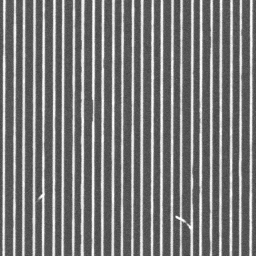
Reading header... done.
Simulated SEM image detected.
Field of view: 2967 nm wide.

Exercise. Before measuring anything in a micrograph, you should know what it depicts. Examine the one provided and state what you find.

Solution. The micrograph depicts parallel lines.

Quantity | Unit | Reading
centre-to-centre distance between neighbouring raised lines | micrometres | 0.115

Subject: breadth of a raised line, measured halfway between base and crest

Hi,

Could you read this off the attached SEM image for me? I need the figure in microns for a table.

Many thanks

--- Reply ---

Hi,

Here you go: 0.0217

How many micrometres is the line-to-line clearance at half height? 0.0985